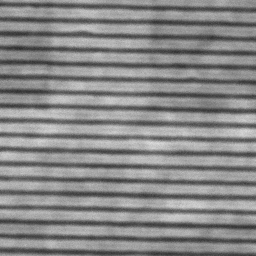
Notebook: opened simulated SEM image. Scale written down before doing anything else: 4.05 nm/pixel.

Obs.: parallel lines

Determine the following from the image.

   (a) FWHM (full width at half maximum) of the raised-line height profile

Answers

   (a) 36.4 nm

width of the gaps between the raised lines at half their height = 24.3 nanometres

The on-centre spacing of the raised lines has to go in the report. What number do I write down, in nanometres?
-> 58.5